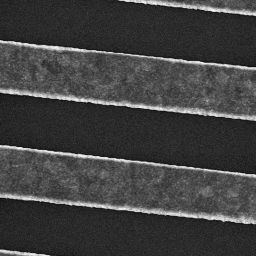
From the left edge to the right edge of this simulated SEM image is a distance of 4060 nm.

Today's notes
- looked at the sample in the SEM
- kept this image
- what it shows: lines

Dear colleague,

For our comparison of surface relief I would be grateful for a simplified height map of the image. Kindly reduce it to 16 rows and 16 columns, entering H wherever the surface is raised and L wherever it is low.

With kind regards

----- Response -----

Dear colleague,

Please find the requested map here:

LLLLLLLLLLLLHHHH
LLLLLLLLLLLLLLLL
LLLLLLLLLLLLLLLL
HHHHHHHHHLLLLLLL
HHHHHHHHHHHHHHHH
HHHHHHHHHHHHHHHH
LLLLLLHHHHHHHHHH
LLLLLLLLLLLLLLLL
LLLLLLLLLLLLLLLL
HHHLLLLLLLLLLLLL
HHHHHHHHHHHHLLLL
HHHHHHHHHHHHHHHH
LLHHHHHHHHHHHHHH
LLLLLLLLLLLHHHHH
LLLLLLLLLLLLLLLL
LLLLLLLLLLLLLLLL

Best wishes